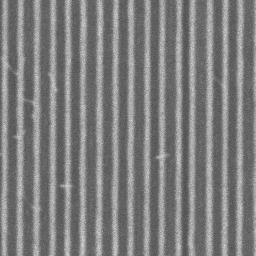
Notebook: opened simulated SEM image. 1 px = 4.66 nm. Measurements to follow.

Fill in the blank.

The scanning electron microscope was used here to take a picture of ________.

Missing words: parallel lines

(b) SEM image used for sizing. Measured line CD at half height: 6.76 pixels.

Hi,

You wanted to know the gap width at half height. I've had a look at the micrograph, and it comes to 43.1 nanometres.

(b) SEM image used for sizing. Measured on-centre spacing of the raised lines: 15.7 px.